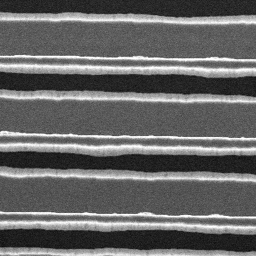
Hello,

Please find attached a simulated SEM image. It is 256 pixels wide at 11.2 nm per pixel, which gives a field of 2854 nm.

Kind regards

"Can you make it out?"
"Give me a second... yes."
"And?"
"lines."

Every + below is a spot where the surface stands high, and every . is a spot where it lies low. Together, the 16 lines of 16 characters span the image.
................
++++++++++++++++
++++++++++++++++
++++++++++++++++
.............++.
................
++++++++++++++++
++++++++++++++++
++++++++++++++++
................
................
++++++++++++++++
++++++++++++++++
++++++++++++++++
................
................